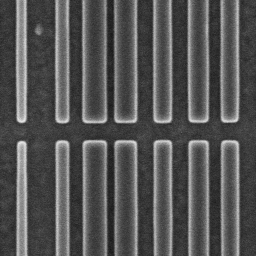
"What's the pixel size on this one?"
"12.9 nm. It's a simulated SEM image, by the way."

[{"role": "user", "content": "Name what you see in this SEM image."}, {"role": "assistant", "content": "groups of lines, slits or small figures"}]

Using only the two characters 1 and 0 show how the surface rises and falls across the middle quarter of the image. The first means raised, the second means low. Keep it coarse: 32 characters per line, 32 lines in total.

10000111110001111100000111100001
10000111110001111100000111100001
10000111110001111100000111100001
10000111110001111100000111100001
10000111110001111100000111100001
10000111110001111100000111100001
10000111110001111100000111100001
10000111110001111100000111100001
10000111110001111100000111100001
10000111110001111100000111100001
10000111110001111100000111100001
10000111110001111100000111100001
10000111110001111100000111100001
10000111110001111100000111100001
10000111110000100000000000000000
00000000000000000000000000000000
00000000000000000000000000000000
00000000000000000000000000000000
00000000000000000000000000000000
10000111110001111100000111000000
10000111110001111100000111100001
10000111110001111100000111100001
10000111110001111100000111100001
10000111110001111100000111100001
10000111110001111100000111100001
10000111110001111100000111100001
10000111110001111100000111100001
10000111110001111100000111100001
10000111110001111100000111100001
10000111110001111100000111100001
10000111110001111100000111100001
10000111110001111100000111100001